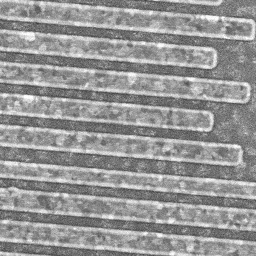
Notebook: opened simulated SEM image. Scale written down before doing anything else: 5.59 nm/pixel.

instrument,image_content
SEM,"parallel lines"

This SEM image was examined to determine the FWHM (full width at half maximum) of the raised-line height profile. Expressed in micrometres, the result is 0.094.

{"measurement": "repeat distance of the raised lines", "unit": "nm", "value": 176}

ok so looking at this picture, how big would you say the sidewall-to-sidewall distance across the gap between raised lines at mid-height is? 82.7 nm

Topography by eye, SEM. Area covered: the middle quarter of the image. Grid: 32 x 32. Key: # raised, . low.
................................
###.............................
##############..................
##########################......
################################
################################
............####################
.......................#########
................................
####............................
###############.................
###########################.....
################################
....############################
...............#################
...........................#####
................................
#####...........................
###################.............
############################....
################################
..##############################
.............###################
.........................#######
................................
................................
####............................
###############.................
###########################.....
......##########################
.................###############
..........................######